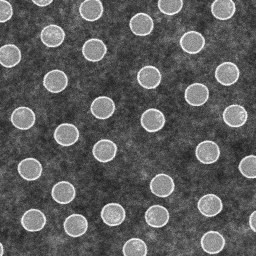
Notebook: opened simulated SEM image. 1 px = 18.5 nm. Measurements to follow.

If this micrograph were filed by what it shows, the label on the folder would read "a regular array of raised bodies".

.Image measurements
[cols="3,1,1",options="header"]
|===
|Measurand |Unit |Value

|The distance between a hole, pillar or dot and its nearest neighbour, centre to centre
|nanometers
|765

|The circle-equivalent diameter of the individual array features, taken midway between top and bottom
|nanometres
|411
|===